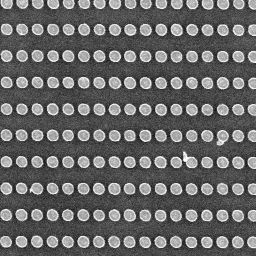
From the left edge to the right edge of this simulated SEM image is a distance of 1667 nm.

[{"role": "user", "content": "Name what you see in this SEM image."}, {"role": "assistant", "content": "a regular array of raised bodies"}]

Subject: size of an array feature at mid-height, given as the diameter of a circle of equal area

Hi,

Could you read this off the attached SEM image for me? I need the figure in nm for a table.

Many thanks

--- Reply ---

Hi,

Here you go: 73.1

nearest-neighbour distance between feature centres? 99.6 nanometers